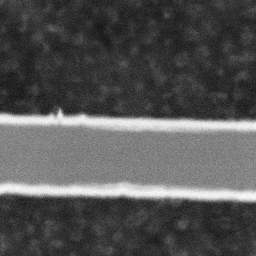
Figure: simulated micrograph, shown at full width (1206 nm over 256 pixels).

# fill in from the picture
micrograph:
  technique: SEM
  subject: one or a few lines or trenches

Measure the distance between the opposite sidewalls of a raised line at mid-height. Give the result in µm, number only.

0.334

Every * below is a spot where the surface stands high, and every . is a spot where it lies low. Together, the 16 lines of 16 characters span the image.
................
................
................
................
................
................
................
*..*............
****************
****************
****************
****************
................
................
................
................